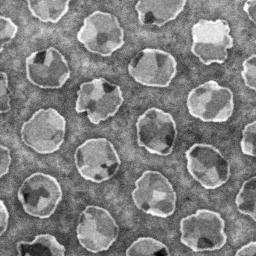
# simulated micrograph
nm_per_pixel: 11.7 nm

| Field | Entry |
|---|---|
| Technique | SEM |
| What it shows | a regular array of raised bodies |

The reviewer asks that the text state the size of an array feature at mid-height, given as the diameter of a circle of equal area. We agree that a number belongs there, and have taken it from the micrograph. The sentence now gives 42.1 pixels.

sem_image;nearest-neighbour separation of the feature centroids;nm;713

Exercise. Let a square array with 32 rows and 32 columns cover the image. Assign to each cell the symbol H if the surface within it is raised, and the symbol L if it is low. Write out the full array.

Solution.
LLLLHHHHLLLLLLLLLHHHHHHLLLLLLLLH
LLLLHHHHLLLLLLLLLHHHHHLLLLLLLLLH
HLLLLHHLLLLHHHHLLHHHHLLLLLLLLLLH
HHLLLLLLLLHHHHHLLLLLLLLLHHHHHLLL
HHLLLLLLLLHHHHHLLLLLLLLLHHHHHLLL
HLLLLLLLLLHHHHHLLLLLLLLLHHHHHLLL
LLLLLHHLLLLLHHLLLLHHLLLLHHHHLLLL
LLLHHHHHLLLLLLLLHHHHHHLLLHHHLLLH
LLLHHHHHHLLLLLLLHHHHHHLLLLLLLLLH
HLLLHHHHLLLLLLLLHHHHHHLLLLLLLLHH
HLLLHHHHLLHHHHLLLLHHHLLLLHHLLLLH
HLLLLLLLLLHHHHHLLLLLLLLLHHHHHLLL
HLLLLLLLLLHHHHHLLLLLLLLHHHHHHLLL
HLLLLLLLLLHHHHHLLLLLLLLLHHHHHLLL
LLLLHHHHLLLHHHLLLLHHHLLLHHHHHLLL
LLLHHHHHLLLLLLLLLHHHHHLLLLLLLLLH
LLLHHHHHLLLLLLLLLHHHHHLLLLLLLLHH
LLLHHHHHLLLLHLLLLHHHHHLLLLLLLLHH
HLLLHHHLLLHHHHLLLLHHHLLLHHHLLLHH
HLLLLLLLLHHHHHHLLLLLLLLHHHHHLLLL
HLLLLLLLLLHHHHHLLLLLLLLLHHHHHLLL
HLLLLLLLLLHHHHLLLLHLLLLLHHHHHLLL
LLLHHHHLLLLLHLLLLHHHHLLLLHHHLLLH
LLLHHHHLLLLLLLLLLHHHHHLLLLLLLLHH
LLHHHHHHLLLLLLLLLHHHHHLLLLLLLLHH
LLLHHHHLLLLLLLLLLHHHHHLLLLLLLLHH
HLLHHHHLLLHHHLLLLLLHHLLLLHLLLLHH
HLLLLLLLLLHHHHLLLLLLLLLHHHHHLLLL
HLLLLLLLLLHHHHHLLLLLLLLHHHHHLLLL
LLLLLHLLLLHHHHHLLLLLLLLHHHHHLLLL
LLHHHHHLLLHHHHLLLHHHLLLHHHHHLLLH
LLHHHHHHLLLLLLLLHHHHHLLLLLLLLLHH